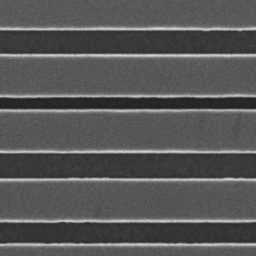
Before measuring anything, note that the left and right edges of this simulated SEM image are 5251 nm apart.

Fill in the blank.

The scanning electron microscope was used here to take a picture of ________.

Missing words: lines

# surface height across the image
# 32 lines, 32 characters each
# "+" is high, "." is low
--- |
++++++++++++++++++++++++++++++++
++++++++++++++++++++++++++++++++
++++++++++++++++++++++++++++++++
++++++++++++++++++++++++++++++++
................................
................................
................................
++++++++++++++++++++++++++++++++
++++++++++++++++++++++++++++++++
++++++++++++++++++++++++++++++++
++++++++++++++++++++++++++++++++
++++++++++++++++++++++++++++++++
................................
................................
++++++++++++++++++++++++++++++++
++++++++++++++++++++++++++++++++
++++++++++++++++++++++++++++++++
++++++++++++++++++++++++++++++++
++++++++++++++++++++++++++++++++
................................
................................
................................
++++++++++++++++++++++++++++++++
++++++++++++++++++++++++++++++++
++++++++++++++++++++++++++++++++
++++++++++++++++++++++++++++++++
++++++++++++++++++++++++++++++++
++++++++++++++++++++++++++++++++
................................
................................
....+..........++++++......+++..
++++++++++++++++++++++++++++++++